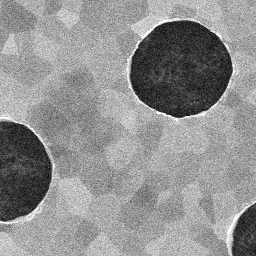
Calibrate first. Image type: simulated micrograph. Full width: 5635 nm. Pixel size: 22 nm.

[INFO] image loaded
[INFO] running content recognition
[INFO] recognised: holes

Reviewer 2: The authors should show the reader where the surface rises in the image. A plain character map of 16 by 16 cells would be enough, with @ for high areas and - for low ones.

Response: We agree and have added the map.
@@@@@@@@@@@@@@@@
@@@@@@@@@@--@@@@
@@@@@@@@@-----@@
@@@@@@@@------@@
@@@@@@@@-------@
@@@@@@@@------@@
@@@@@@@@@----@@@
@@@@@@@@@@@@@@@@
--@@@@@@@@@@@@@@
---@@@@@@@@@@@@@
---@@@@@@@@@@@@@
---@@@@@@@@@@@@@
---@@@@@@@@@@@@@
--@@@@@@@@@@@@@-
@@@@@@@@@@@@@@--
@@@@@@@@@@@@@@--